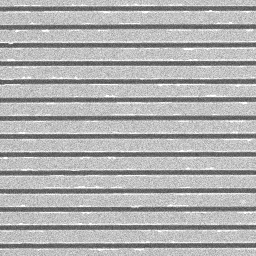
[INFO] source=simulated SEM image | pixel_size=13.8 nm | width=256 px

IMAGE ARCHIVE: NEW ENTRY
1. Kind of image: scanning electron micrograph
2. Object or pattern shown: parallel lines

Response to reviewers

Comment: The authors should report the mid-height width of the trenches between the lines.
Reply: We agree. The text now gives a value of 0.064 microns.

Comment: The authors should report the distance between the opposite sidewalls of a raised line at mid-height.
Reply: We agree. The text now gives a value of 190 nm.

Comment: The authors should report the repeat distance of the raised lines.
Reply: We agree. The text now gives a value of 18.2 pixels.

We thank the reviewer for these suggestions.